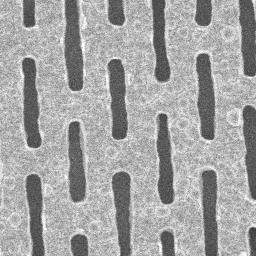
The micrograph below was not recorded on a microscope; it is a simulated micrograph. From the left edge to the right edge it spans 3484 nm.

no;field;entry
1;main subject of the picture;holes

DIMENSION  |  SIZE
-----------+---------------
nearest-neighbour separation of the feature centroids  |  1030 nm